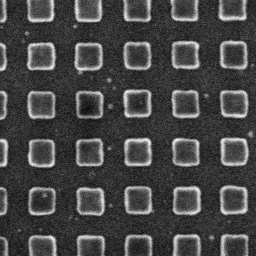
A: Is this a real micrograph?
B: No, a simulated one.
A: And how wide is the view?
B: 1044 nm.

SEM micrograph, a regular array of raised bodies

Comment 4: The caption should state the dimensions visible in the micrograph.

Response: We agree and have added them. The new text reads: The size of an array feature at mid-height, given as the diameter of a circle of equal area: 117 nm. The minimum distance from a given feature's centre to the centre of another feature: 195 nm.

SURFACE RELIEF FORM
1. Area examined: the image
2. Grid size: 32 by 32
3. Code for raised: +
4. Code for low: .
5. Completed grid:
+...+++...+++...+++...+++...+++.
+...+++...+++...+++...+++...+++.
....++....++....++.....+........
................................
................................
..........++....++....++....++..
+...+++...+++...+++...+++...+++.
+...+++..++++...+++...+++...+++.
....++....++....++..............
................................
................................
..........+.....+++...++....++..
+...+++...+++...+++...+++...+++.
+...+++...+++...+++...+++...+++.
+...+++...+++...++....+++.......
................................
................................
..........++.....+....++....++..
+...+++...+++...+++...+++...+++.
+...+++...+++...+++...+++...+++.
....+++...++....++....++....++..
................................
................................
................++....++....++..
+...+++...+++...+++...+++...+++.
+...+++...+++...+++...+++...+++.
+...+++...+++...++....+++...++..
................................
................................
................+.....+++...+...
+...+++...+++...+++...+++...+++.
+...+++...+++...+++...+++...+++.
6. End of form